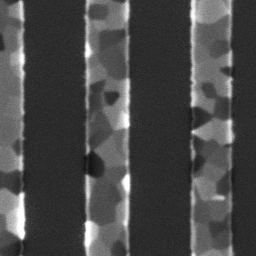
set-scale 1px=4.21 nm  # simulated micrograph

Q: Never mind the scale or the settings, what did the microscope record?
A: one or a few lines or trenches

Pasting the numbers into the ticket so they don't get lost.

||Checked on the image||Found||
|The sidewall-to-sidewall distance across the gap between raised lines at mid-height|269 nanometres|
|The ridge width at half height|168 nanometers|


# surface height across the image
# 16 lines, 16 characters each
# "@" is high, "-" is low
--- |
@----@@@----@@--
@----@@@----@@--
@----@@@----@@--
@----@@@----@@--
@----@@@----@@--
@----@@@----@@--
@----@@@----@@--
@----@@@----@@--
@----@@@----@@--
@----@@@----@@--
@----@@@----@@--
@----@@@----@@--
@----@@@----@@--
@----@@@----@@--
@----@@@----@@--
@----@@@----@@--